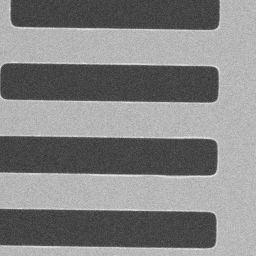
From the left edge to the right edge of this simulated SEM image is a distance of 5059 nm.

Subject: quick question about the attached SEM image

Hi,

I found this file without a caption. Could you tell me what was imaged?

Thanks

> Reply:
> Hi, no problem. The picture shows groups of lines, slits or small figures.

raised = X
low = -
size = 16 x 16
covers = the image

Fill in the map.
X-------------XX
X-------------XX
XXXXXXXXXXXXXXXX
XXXXXXXXXXXXXXXX
--------------XX
--------------XX
XXXXXXXXXXXXXXXX
XXXXXXXXXXXXXXXX
----XXXXXXXXXXXX
--------------XX
--------------XX
XXXXXXXXXXXXXXXX
XXXXXXXXXXXXXXXX
-------------XXX
--------------XX
XXXXXXXX-----XXX